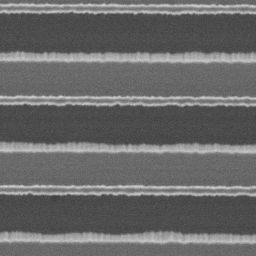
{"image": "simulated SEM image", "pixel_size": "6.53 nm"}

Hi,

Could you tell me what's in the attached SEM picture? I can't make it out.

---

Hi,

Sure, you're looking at lines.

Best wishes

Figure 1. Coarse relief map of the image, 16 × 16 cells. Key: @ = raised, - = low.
@@@@@@@@@@@@@@@@
----------------
----------------
----------------
@@@@@@@@@@@@@@@@
@@@@@@@@@@@@@@@@
@--@@@@@@@@@@@@@
----------------
----------------
@@@@@@@@@@@@@@@@
@@@@@@@@@@@@@@@@
@@@@@@@@@@@@@@@@
----------------
----------------
----------------
@@@@@@@@@@@@@@@@